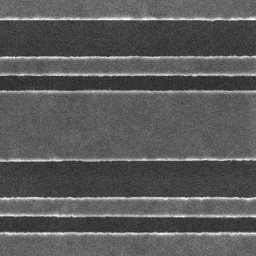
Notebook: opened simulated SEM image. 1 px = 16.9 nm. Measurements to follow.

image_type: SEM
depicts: lines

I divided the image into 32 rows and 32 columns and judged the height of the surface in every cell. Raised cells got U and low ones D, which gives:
UUUUUUUUUUUUUUUUUUUUUUUUUUUUUUUU
UUUUUUUUUUUUUUUUUUUUUUUUUUUUUUUU
DDDDDDDDDDDDDDDDDDDDDDDDDDDDDDDD
DDDDDDDDDDDDDDDDDDDDDDDDDDDDDDDD
DDDDDDDDDDDDDDDDDDDDDDDDDDDDDDDD
DDDDDDDDDDDDDDDDDDDDDDDDDDDDDDDD
DDDDDDDDDDDDDDDDDDDDDDDDDDDDDDDD
UUUUUUUUUUUUUUUUUUUUUUUUUUUUUUUU
UUUUUUUUUUUUUUUUUUUUUUUUUUUUUUUU
DDDDDDDDDDDDDDDDDDDDDDDDDDDDDDDD
DDDDDDDDDDDDDDDDDDDDDDDDDDDDDDDD
UUUUUUUUUUUUUUUUUUUUUUUUUUUUUUUU
UUUUUUUUUUUUUUUUUUUUUUUUUUUUUUUU
UUUUUUUUUUUUUUUUUUUUUUUUUUUUUUUU
UUUUUUUUUUUUUUUUUUUUUUUUUUUUUUUU
UUUUUUUUUUUUUUUUUUUUUUUUUUUUUUUU
UUUUUUUUUUUUUUUUUUUUUUUUUUUUUUUU
UUUUUUUUUUUUUUUUUUUUUUUUUUUUUUUU
UUUUUUUUUUUUUUUUUUUUUUUUUUUUUUUU
UUUUUUUUUUUUUUUUUUUUUUUUUUUUUUUU
DDDDDDDDDDDDDDDDDDDDDDDDDDDDDDDD
DDDDDDDDDDDDDDDDDDDDDDDDDDDDDDDD
DDDDDDDDDDDDDDDDDDDDDDDDDDDDDDDD
DDDDDDDDDDDDDDDDDDDDDDDDDDDDDDDD
DDDDDDDDDDDDDDDDDDDDDDDDDDDDDDDD
UUUUUUUUUUUUUUUUUUUUUUUUUUUUUUUU
UUUUUUUUUUUUUUUUUUUUUUUUUUUUUUUU
DDDDDDDDDDDDDDDDDDDDDDDDDDDDDDDD
DDDDDDDDDDDDDDDDDDDDDDDDDDDDDDDD
UUUUUUUUUUUUUUUUUUUUUUUUUUUUUUUU
UUUUUUUUUUUUUUUUUUUUUUUUUUUUUUUU
UUUUUUUUUUUUUUUUUUUUUUUUUUUUUUUU